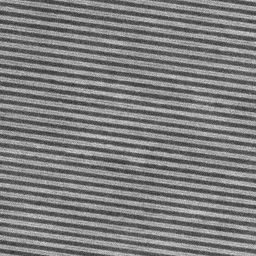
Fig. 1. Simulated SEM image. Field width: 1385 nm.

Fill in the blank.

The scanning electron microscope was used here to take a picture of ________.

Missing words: parallel lines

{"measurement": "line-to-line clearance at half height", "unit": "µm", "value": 0.0308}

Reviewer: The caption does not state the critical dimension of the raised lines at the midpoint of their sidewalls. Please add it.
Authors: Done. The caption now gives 0.0161 um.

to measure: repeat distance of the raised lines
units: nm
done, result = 47.3